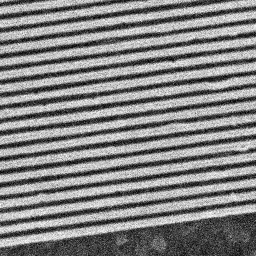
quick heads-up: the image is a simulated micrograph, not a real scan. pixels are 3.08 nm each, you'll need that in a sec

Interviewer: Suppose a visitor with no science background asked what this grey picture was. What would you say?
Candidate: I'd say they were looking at parallel lines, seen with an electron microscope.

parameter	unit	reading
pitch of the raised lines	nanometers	39.3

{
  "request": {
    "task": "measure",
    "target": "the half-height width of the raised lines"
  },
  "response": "7.31 pixels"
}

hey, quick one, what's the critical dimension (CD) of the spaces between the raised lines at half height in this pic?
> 17.1 nanometres